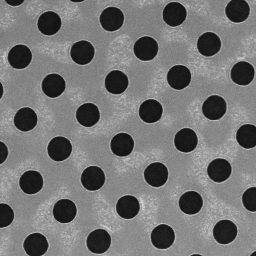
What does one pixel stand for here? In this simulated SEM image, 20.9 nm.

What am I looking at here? a regular array of holes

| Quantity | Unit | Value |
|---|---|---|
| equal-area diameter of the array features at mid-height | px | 24.2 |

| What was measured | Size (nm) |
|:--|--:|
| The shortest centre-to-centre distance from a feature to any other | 914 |